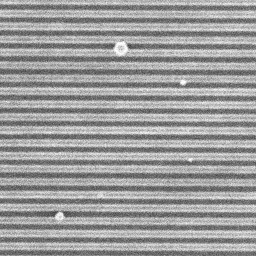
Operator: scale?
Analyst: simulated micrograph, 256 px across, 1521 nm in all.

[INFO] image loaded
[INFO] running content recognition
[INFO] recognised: parallel lines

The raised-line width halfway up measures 6.13 pixels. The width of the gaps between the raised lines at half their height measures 0.0416 micrometres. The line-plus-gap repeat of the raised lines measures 76.9 nm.